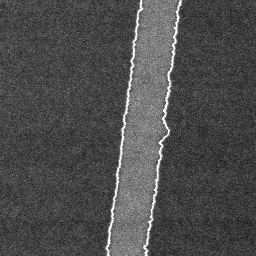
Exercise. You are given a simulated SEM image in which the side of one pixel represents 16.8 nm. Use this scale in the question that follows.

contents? one or a few lines or trenches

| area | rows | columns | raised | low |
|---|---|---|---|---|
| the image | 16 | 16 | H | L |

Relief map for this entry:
HHHHHHHHHLLHHHHH
HHHHHHHHHLLHHHHH
HHHHHHHHLLLHHHHH
HHHHHHHHLLLHHHHH
HHHHHHHHLLLHHHHH
HHHHHHHHLLLHHHHH
HHHHHHHHLLHHHHHH
HHHHHHHHLLHHHHHH
HHHHHHHHLLHHHHHH
HHHHHHHHLLHHHHHH
HHHHHHHLLLHHHHHH
HHHHHHHLLLHHHHHH
HHHHHHHLLLHHHHHH
HHHHHHHLLHHHHHHH
HHHHHHHLLHHHHHHH
HHHHHHHLLHHHHHHH